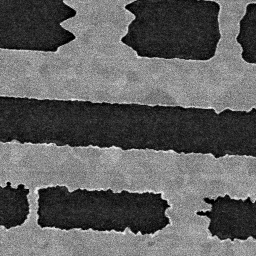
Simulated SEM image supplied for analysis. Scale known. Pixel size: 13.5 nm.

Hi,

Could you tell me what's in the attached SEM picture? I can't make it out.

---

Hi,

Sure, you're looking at one or a few lines or trenches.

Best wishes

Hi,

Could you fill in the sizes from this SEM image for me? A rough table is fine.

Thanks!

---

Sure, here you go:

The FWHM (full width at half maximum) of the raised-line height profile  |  627 nanometers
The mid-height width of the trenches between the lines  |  0.597 micrometres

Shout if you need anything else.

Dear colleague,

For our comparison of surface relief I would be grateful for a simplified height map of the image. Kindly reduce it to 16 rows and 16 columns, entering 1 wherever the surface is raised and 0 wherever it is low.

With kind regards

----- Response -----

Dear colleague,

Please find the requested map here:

0000111100000010
0000111100000010
0000111100000010
1111111110000110
1111111111111111
1111111111111111
0000000001111111
0000000000000000
0000000000000000
1111111111100000
1111111111111111
1111111111111111
0000000000111000
0000000000111000
1111111100111000
1111111111111111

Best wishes